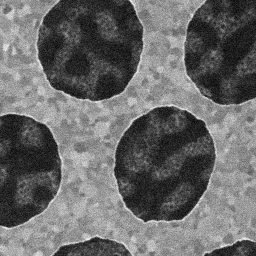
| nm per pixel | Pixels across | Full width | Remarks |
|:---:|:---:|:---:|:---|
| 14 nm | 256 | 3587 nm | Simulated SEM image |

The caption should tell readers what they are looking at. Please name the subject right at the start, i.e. holes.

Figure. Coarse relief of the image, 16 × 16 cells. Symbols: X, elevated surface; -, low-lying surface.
XXX-----XXXX----
XXX------XXX----
XX-------XXX----
XX-------XX-----
XXX-----XXXX----
XXX-----XXXX----
XXXXXXXXXXXXXX-X
--XXXXXX-----XXX
---XXXXX-----XXX
----XXX------XXX
----XXX------XXX
----XXX------XXX
---XXXXX----XXXX
--XXXXXX----XXXX
XXXXXXXXXXXXXXXX
XXXX----XXXXXX--